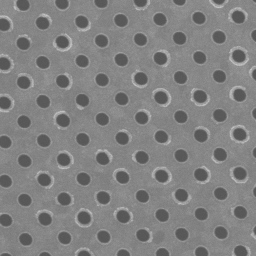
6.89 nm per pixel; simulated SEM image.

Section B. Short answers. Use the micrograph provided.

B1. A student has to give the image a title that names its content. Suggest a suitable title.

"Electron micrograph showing a regular array of holes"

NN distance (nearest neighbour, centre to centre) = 188 nm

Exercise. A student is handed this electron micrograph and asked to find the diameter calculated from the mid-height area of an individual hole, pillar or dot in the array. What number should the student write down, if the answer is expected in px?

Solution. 13.9